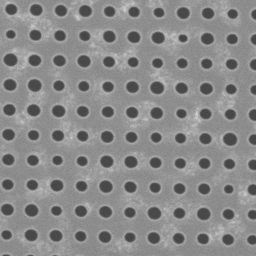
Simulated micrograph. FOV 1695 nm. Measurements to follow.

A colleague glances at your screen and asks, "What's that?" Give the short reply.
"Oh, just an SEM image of a regular array of holes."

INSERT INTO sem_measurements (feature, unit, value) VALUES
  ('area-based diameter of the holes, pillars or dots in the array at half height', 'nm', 75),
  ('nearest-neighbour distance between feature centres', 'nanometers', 161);